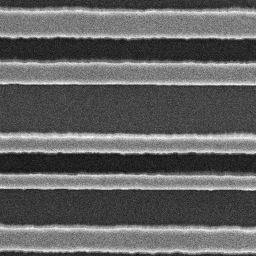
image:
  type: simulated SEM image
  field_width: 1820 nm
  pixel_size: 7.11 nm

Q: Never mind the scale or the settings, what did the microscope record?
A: lines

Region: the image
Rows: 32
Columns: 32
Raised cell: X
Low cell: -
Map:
--------------------------------
XXXXXXXXXXXX------XXXX------XX--
XXXXXXXXXXXXXXXXXXXXXXXXXXXXXXXX
XXXXXXXXXXXXXXXXXXXXXXXXXXXXXXXX
XXXXXXXXXXXXXXXXXXXXXXXXXXXXXXXX
--------------------------------
--------------------------------
--------------------------------
XXXXXXXXXXXXXXXXXXXXXXXXXXXXXXXX
XXXXXXXXXXXXXXXXXXXXXXXXXXXXXXXX
---------------------XX-XXXXXXXX
--------------------------------
--------------------------------
--------------------------------
--------------------------------
--------------------------------
--------------------------------
XXXXXXXXXXXXXXXXXXXXXXXXXXXXXXXX
XXXXXXXXXXXXXXXXXXXXXXXXXXXXXXXX
--------------------------------
--------------------------------
--------------------------------
XXXXXXXXXXXXXXXXXXXXXXXXXXXXXXXX
XXXXXXXXXXXXXXXXXXXXXXXXXXXXXXXX
--------------------------------
--------------------------------
--------------------------------
--------------------------------
X--XX-XX--------X---------------
XXXXXXXXXXXXXXXXXXXXXXXXXXXXXXXX
XXXXXXXXXXXXXXXXXXXXXXXXXXXXXXXX
--------------XXX-XXXX-XX--XXXXX